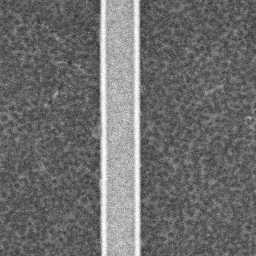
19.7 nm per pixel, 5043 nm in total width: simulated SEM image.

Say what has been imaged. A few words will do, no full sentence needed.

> one or a few lines or trenches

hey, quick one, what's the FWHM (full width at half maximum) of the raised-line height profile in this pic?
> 643 nanometres